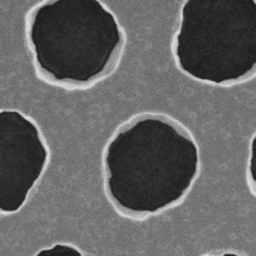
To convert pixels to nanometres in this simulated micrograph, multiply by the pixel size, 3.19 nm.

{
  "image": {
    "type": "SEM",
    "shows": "holes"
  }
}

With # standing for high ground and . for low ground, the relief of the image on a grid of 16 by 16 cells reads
##....#####.....
##.....####.....
##......###.....
##.....####.....
###....#####....
################
################
..######...#####
..#####.....####
...####.....####
...####.....####
..#####.....####
.######....#####
################
################
###.############